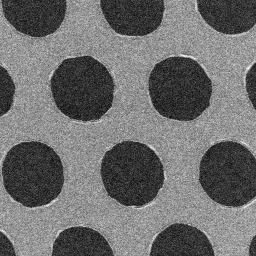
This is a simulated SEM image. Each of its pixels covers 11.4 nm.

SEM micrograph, raised bodies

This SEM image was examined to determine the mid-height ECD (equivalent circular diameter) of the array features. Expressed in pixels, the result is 65.8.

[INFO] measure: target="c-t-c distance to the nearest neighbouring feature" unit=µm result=1.11